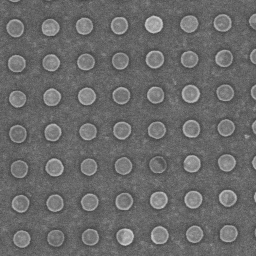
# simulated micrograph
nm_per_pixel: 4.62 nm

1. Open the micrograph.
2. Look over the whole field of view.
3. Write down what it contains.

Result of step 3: a regular array of raised bodies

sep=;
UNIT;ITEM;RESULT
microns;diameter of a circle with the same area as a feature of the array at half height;0.0769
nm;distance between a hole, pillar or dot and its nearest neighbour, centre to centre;158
